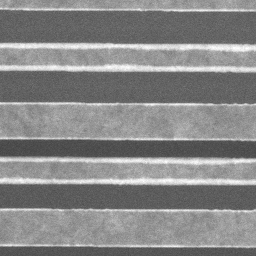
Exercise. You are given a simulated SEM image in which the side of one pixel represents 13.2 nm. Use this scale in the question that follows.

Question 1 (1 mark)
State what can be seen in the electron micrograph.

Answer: lines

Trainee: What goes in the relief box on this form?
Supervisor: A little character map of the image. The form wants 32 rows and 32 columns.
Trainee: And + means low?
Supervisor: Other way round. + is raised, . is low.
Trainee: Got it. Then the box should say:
++++++++++++++++++++++++++++++++
................................
................................
................................
................................
................................
++++++++++++++++++++++++++++++++
++++++++++++++++++++++++++++++++
++++++++++++++++++++++++++++++++
................................
................................
................................
................................
++++++++++++++++++++++++++++++++
++++++++++++++++++++++++++++++++
++++++++++++++++++++++++++++++++
++++++++++++++++++++++++++++++++
..............................++
................................
................................
++++++++++++++++++++++++++++++++
++++++++++++++++++++++++++++++++
++++++++++++++++++++++++++++++++
................................
................................
................................
++++++++++++++++++++++++++++++++
++++++++++++++++++++++++++++++++
++++++++++++++++++++++++++++++++
++++++++++++++++++++++++++++++++
++++++++++++++++++++++++++++++++
................................